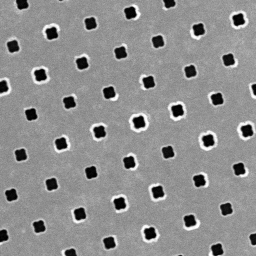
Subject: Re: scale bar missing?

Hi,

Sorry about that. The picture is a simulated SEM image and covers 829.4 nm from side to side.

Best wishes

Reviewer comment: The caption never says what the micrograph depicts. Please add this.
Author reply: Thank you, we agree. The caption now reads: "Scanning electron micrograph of a regular array of holes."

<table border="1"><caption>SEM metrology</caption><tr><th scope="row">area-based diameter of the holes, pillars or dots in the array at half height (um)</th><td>0.0413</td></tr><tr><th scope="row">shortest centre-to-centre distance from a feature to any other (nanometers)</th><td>130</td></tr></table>